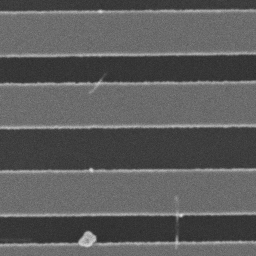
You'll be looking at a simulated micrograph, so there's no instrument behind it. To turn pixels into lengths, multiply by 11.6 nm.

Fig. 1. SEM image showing lines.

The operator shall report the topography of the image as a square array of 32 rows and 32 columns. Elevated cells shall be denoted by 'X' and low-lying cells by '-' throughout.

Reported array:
--------------------------------
XXXXXXXXXXXXXXXXXXXXXXXXXXXXXXXX
XXXXXXXXXXXXXXXXXXXXXXXXXXXXXXXX
XXXXXXXXXXXXXXXXXXXXXXXXXXXXXXXX
XXXXXXXXXXXXXXXXXXXXXXXXXXXXXXXX
XXXXXXXXXXXXXXXXXXXXXXXXXXXXXXXX
XXXXXXXXXXXXXXXXXXXXXXXXXXXXXXXX
--------------------------------
--------------------------------
--------------------------------
XXXXXXXXXXXXXXXXXXXXXXXXXXXXXXXX
XXXXXXXXXXXXXXXXXXXXXXXXXXXXXXXX
XXXXXXXXXXXXXXXXXXXXXXXXXXXXXXXX
XXXXXXXXXXXXXXXXXXXXXXXXXXXXXXXX
XXXXXXXXXXXXXXXXXXXXXXXXXXXXXXXX
XXXXXXXXXXXXXXXXXXXXXXXXXXXXXXXX
--------------------------------
--------------------------------
--------------------------------
--------------------------------
--------------------------------
XXXXXXXXXXXXXXXXXXXXXXXXXXXXXXXX
XXXXXXXXXXXXXXXXXXXXXXXXXXXXXXXX
XXXXXXXXXXXXXXXXXXXXXXXXXXXXXXXX
XXXXXXXXXXXXXXXXXXXXXXXXXXXXXXXX
XXXXXXXXXXXXXXXXXXXXXXXXXXXXXXXX
XXXXXXXXXXXXXXXXXXXXXXXXXXXXXXXX
--------------------------------
--------------------------------
----------XX--------------------
-X-XXXXXXXXXXXXXXXXXXXXXXXXXXXXX
XXXXXXXXXXXXXXXXXXXXXXXXXXXXXXXX